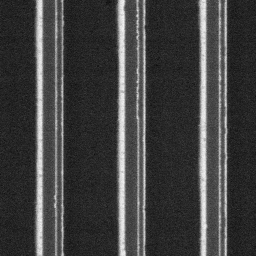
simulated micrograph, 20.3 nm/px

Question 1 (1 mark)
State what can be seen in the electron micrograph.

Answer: lines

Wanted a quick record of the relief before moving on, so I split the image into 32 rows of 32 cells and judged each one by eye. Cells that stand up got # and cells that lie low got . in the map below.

.....###.......###........##....
.....###.......###........##....
.....###.......###........##....
.....###.......###........##....
.....###.......###........##....
.....###.......###........##....
.....###.......###........##....
.....###.......###........##....
.....###.......###........##....
.....###.......###........##....
.....###.......###........##....
.....###.......###........##....
.....###.......###........##....
.....###.......###........##....
.....###.......###........##....
.....###.......###........##....
.....###.......###........##....
.....###.......###........##....
.....###.......###........##....
.....###.......###........##....
.....###.......###........##....
.....###.......###........##....
.....###.......###........##....
.....###.......###........##....
.....###.......###........##....
.....###.......###........##....
.....###.......###........##....
.....###.......###........##....
.....###.......###........##....
.....###.......###........##....
.....###.......###........##....
.....###........##........##....